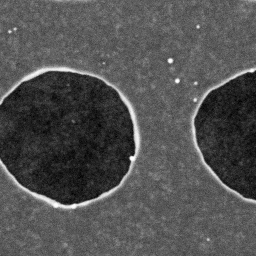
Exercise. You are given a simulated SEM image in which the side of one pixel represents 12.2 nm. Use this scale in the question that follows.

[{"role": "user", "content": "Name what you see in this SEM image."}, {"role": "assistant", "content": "holes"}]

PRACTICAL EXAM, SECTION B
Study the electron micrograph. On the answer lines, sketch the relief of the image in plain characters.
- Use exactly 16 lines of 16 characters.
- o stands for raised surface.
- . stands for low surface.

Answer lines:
oooooooooooooooo
oooooooooooooooo
oooooooooooooooo
oooooooooooooooo
ooo..ooooooooooo
o......ooooooo..
........ooooo...
........oooo....
........oooo....
........ooooo...
........ooooo...
o......ooooooo..
ooo...oooooooooo
oooooooooooooooo
oooooooooooooooo
oooooooooooooooo